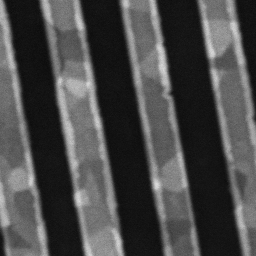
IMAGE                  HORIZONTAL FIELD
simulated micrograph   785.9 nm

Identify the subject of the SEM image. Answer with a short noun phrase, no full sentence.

one or a few lines or trenches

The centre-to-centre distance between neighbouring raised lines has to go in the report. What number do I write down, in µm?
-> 0.235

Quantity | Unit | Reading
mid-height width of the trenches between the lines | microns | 0.139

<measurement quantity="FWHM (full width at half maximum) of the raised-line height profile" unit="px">30.8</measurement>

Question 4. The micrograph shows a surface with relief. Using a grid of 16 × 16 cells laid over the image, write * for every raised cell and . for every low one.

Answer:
...**...**...*..
...**...**...**.
*..**...**...**.
*..**...**...**.
*...**..**...**.
*...**...**...*.
*...**...**...**
*...**...**...**
**..**...**...**
**..**...**...**
**...**...*...**
**...**...**...*
**...**...**...*
***..**...**...*
***..**...**...*
***..***..**...*